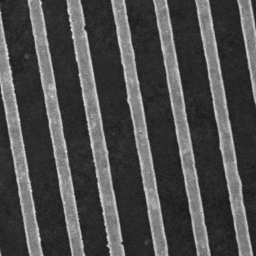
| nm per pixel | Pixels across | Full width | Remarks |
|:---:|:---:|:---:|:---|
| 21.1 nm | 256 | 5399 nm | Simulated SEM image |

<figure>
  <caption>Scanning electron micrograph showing parallel lines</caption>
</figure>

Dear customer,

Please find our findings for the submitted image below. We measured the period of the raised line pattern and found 872 nm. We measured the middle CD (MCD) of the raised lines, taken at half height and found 223 nm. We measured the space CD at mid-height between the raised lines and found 649 nanometres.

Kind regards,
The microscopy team